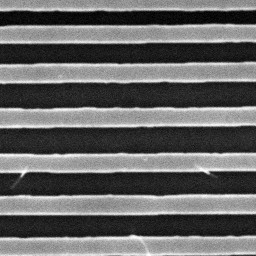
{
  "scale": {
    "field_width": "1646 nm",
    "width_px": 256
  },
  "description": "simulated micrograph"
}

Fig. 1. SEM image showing lines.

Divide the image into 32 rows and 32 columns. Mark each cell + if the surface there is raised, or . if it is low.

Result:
++++++++++++++++++++++++++++++++
................................
................................
++++++++++++++++++++++++++++++++
++++++++++++++++++++++++++++++++
................................
................................
................................
++++++++++++++++++++++++++++++++
++++++++++++++++++++++++++++++++
................................
................................
................................
..............................++
++++++++++++++++++++++++++++++++
++++++++++++++++++++++++++++++++
................................
................................
................................
++++++++++++++++++++++++++++++++
++++++++++++++++++++++++++++++++
++++..++++++++..................
................................
................................
.+++...+.+++++++++++++++++++++++
++++++++++++++++++++++++++++++++
++++++++++++++++++++++++++++++++
................................
................................
................................
++++++++++++++++++++++++++++++++
++++++++++++++++++++++++++++++++